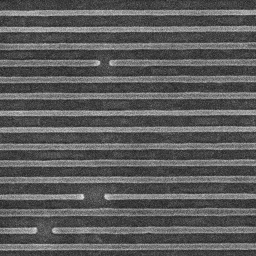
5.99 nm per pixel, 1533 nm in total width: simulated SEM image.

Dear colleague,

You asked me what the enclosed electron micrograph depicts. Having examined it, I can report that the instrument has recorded parallel lines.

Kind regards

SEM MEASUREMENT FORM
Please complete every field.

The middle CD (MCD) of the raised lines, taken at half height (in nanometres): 35.2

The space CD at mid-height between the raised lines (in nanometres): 64.4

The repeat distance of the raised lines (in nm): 100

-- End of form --